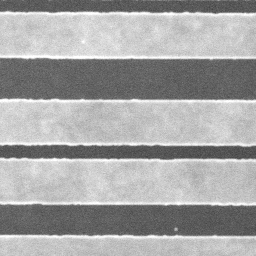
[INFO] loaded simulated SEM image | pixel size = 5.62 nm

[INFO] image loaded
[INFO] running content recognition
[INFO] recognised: lines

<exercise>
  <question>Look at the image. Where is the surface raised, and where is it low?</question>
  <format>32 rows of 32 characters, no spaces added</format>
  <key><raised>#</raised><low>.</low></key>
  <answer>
................................
#...............................
################################
################################
################################
################################
################################
................................
................................
................................
................................
................................
####.###..#.#...#...............
################################
################################
################################
################################
################################
................................
................................
################################
################################
################################
################################
################################
....................#.#...######
................................
................................
................................
###########.#####.#####...#.....
################################
################################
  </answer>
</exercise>